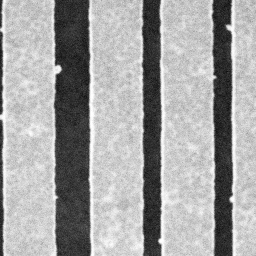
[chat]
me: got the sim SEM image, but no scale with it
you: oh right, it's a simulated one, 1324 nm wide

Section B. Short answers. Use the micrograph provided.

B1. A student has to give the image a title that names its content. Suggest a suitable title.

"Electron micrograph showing lines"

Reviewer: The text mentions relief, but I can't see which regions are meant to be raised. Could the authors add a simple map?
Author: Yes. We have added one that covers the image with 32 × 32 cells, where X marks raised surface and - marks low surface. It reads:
XXXXXXX----XXXXXXX--XXXXXXX--XXX
XXXXXXX----XXXXXXX--XXXXXX---XXX
XXXXXXX----XXXXXXX--XXXXXX---XXX
XXXXXXX----XXXXXXX--XXXXXXX--XXX
XXXXXXX----XXXXXXX--XXXXXXX--XXX
XXXXXXX----XXXXXXX--XXXXXXX--XXX
XXXXXXX----XXXXXXX--XXXXXX---XXX
XXXXXXX----XXXXXXX--XXXXXXX--XXX
XXXXXXX----XXXXXXX--XXXXXXX--XXX
XXXXXXX----XXXXXXX--XXXXXXX--XXX
XXXXXXX----XXXXXXX--XXXXXXX--XXX
XXXXXXX----XXXXXXX--XXXXXXX--XXX
XXXXXXX----XXXXXXX--XXXXXXX--XXX
XXXXXXX----XXXXXXX--XXXXXXX--XXX
XXXXXXX----XXXXXXX--XXXXXXX--XXX
XXXXXXX----XXXXXXX--XXXXXXX--XXX
-XXXXXX-----XXXXXX--XXXXXXX--XXX
-XXXXXX-----XXXXXX--XXXXXXX--XXX
XXXXXXX----XXXXXXX--XXXXXXX--XXX
XXXXXXX----XXXXXXX--XXXXXXX--XXX
XXXXXXX----XXXXXXX--XXXXXXX--XXX
XXXXXXX----XXXXXXX--XXXXXXX--XXX
-XXXXXX----XXXXXXX--XXXXXXX--XXX
-XXXXXX----XXXXXXX--XXXXXXX--XXX
XXXXXXX----XXXXXXX--XXXXXXX--XXX
-XXXXXX-----XXXXXX--XXXXXXX--XXX
-XXXXXX----XXXXXXX--XXXXXXX--XXX
-XXXXXX----XXXXXXX--XXXXXXX--XXX
XXXXXXX----XXXXXXX--XXXXXXX--XXX
XXXXXXX----XXXXXXX--XXXXXXX--XXX
XXXXXXX-----XXXXXX--XXXXXXX--XXX
-XXXXXX-----XXXXXX--XXXXXXX--XXX